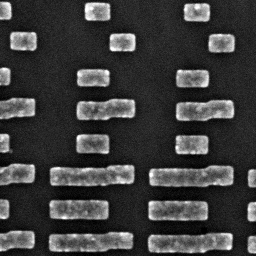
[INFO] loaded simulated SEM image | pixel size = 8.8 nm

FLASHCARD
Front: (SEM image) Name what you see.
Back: wiring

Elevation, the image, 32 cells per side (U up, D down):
UDDDDDDDDDDUUDDDDDDDDDDDDDDDDDDD
UDDDDDDDDDDUUUDDDDDDDDDUUUDDDDDD
DDDDDDDDDDDDDDDDDDDDDDDUUUDDDDDD
DDDDDDDDDDDDDDDDDDDDDDDDDDDDDDDD
DUUUDDDDDDDDDDUUUDDDDDDDDDDUUDDD
DUUUUDDDDDDDDDUUUDDDDDDDDDUUUDDD
DDDDDDDDDDDDDDDDDDDDDDDDDDDDDDDD
DDDDDDDDDDDDDDDDDDDDDDDDDDDDDDDD
DDDDDDDDDDDDDDDDDDDDDDDDDDDDDDDD
UDDDDDDDDDUUUUDDDDDDDDUUUUDDDDDD
UDDDDDDDDDUUUDDDDDDDDDUUUUDDDDDD
DDDDDDDDDDDDDDDDDDDDDDDDDDDDDDDD
DUUUDDDDDDDDDDUUDDDDDDDDDDDDDDDD
UUUUDDDDDDUUUUUUUDDDDDUUUUUUUDDD
UUUDDDDDDDUUUUUUUDDDDDUUUUUUUDDD
DDDDDDDDDDDDDDDDDDDDDDDDDDDDDDDD
DDDDDDDDDDDDDDDDDDDDDDDDDDDDDDDD
UDDDDDDDDDUUUUDDDDDDDDUUUUDDDDDD
UDDDDDDDDDUUUUDDDDDDDDUUUUDDDDDD
DDDDDDDDDDDDDDDDDDDDDDDDDDDDDDDD
DDDDDDDDDDDDDDDDDDDDDDDDDDDDDDDD
UUUUDDUUUUUUUUUUUDDUUUUUUUUUUDDU
UUUUDDUUUUUUUUUUUDDUUUUUUUUUUDDU
DDDDDDDDDDDDDDDDDDDDDDDDDDDDDDDD
DDDDDDDDDDDDDDDDDDDDDDDDDDDDDDDD
UDDDDDUUUUUUUDDDDDDUUUUUUUDDDDDU
UDDDDDUUUUUUUDDDDDDUUUUUUUDDDDDU
DDDDDDDDDDDDDDDDDDDDDDDDDDDDDDDU
DDDDDDDDDDDDDDDDDDDDDDDDDDDDDDDD
UUUUDDUUUUUUUUUUDDDUUUUUUUUUUDDD
UUUUDDUUUUUUUUUUUDDUUUUUUUUUUDDU
DDDDDDDDDDDDDDDDDDDDUDUUUDDDDDDU